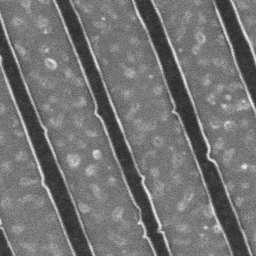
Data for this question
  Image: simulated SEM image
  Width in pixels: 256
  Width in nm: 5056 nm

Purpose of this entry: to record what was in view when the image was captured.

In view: one or a few lines or trenches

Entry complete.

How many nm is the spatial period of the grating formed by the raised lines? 1460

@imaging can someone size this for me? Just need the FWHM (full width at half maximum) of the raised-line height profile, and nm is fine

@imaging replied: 354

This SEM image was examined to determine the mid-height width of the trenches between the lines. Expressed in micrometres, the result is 1.1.